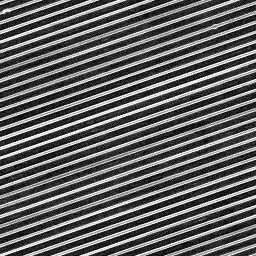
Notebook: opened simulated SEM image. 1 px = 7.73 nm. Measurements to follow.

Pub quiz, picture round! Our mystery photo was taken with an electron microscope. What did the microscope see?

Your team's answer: parallel lines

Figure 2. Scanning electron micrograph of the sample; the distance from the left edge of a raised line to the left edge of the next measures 9.17 pixels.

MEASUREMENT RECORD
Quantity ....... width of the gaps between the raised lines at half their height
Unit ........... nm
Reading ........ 50.3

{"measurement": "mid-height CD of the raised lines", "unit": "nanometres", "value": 21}